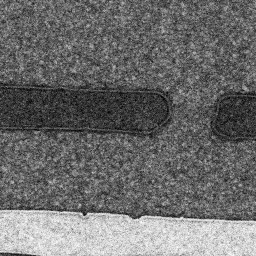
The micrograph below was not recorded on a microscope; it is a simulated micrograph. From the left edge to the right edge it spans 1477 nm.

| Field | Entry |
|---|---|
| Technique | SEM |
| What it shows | one or a few lines or trenches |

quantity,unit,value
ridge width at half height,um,0.235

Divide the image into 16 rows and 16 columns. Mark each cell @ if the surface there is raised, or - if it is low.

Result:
----------------
----------------
----------------
----------------
----------------
@@@@------------
@@@@@@@@@@@---@@
@@@@@@@@@@---@@@
--------------@@
----------------
----------------
----------------
----------------
@@@@@@@@--------
@@@@@@@@@@@@@@@@
@@@@@@@@@@@@@@@@